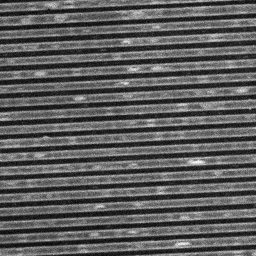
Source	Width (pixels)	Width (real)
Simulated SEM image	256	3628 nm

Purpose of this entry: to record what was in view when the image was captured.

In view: parallel lines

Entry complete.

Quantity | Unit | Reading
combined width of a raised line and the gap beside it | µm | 0.193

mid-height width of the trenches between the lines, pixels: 5.62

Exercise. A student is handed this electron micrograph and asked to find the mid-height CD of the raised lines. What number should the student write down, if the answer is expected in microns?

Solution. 0.118